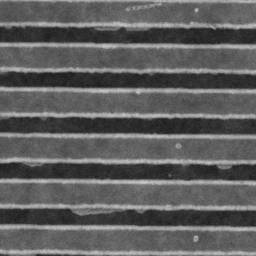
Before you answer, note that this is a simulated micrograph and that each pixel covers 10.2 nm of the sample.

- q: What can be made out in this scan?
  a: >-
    lines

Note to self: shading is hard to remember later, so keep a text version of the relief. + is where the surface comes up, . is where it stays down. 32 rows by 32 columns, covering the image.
++++++++++++++++++++++++++++++++
++++++++++++++++++++++++++++++++
++++++++++++++++++++++++++++++++
..........................+..+..
................................
................................
++++++++++++++++++++++++++++++++
++++++++++++++++++++++++++++++++
++++++++++++++++++++++++++++++++
................................
................................
++++++++++++++++++++++++++++++++
++++++++++++++++++++++++++++++++
++++++++++++++++++++++++++++++++
.......++.++++++++++++++++++++++
................................
................................
++++++++++++++++++++++++++++++++
++++++++++++++++++++++++++++++++
++++++++++++++++++++++++++++++++
................................
................................
................................
++++++++++++++++++++++++++++++++
++++++++++++++++++++++++++++++++
++++++++++++++++++++++++++++++++
................................
................................
+++++++++++++++++++++++++++++...
++++++++++++++++++++++++++++++++
++++++++++++++++++++++++++++++++
++++++++++++++++++++++++++++++++